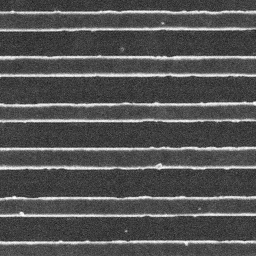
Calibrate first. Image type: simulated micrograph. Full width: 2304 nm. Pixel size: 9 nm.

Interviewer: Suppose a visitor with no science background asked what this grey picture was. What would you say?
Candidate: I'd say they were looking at lines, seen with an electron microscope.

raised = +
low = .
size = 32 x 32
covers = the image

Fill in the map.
................................
.............+...+++............
++++++++++++++++++++++++++++++++
++++++++++++++++++++++++++++++++
................................
................................
................................
++++++++++++++++++++++++++++++++
++++++++++++++++++++++++++++++++
+++++++........................+
................................
................................
................................
++++++++++++++++++++++++++++++++
++++++++++++++++++++++++++++++++
................................
................................
................................
..............................++
++++++++++++++++++++++++++++++++
++++++++++++++++++++++++++++++++
................................
................................
................................
................................
++++++++++++++++++++++++++++++++
++++++++++++++++++++++++++++++++
................................
................................
................................
++++++++++++++++++++++++++++++++
++++++++++++++++++++++++++++++++